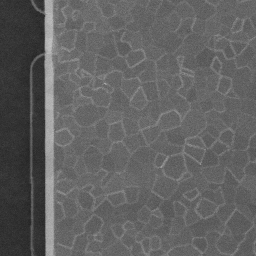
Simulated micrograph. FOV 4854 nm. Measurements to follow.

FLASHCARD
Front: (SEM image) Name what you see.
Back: wiring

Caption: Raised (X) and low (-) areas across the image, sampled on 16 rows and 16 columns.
---XXXXXXXXXXXXX
---XXXXXXXXXXXXX
---XXXXXXXXXXXXX
---XXXXXXXXXXXXX
---XXXXXXXXXXXXX
---XXXXXXXXXXXXX
---XXXXXXXXXXXXX
---XXXXXXXXXXXXX
---XXXXXXXXXXXXX
---XXXXXXXXXXXXX
---XXXXXXXXXXXXX
---XXXXXXXXXXXXX
---XXXXXXXXXXXXX
---XXXXXXXXXXXXX
---XXXXXXXXXXXXX
---XXXXXXXXXXXXX